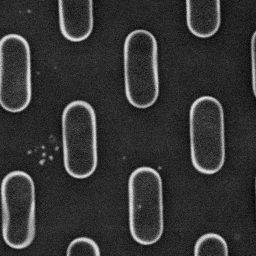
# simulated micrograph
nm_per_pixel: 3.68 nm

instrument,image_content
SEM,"groups of lines, slits or small figures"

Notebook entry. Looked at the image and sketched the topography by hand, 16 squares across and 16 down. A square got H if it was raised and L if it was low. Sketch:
LLLLHHLLLLLLHHLL
LLLLHHLLLLLLHHLL
HLLLLLLLHHLLLLLL
HHLLLLLLHHLLLLLL
HHLLLLLLHHLLLLLL
HHLLLLLLHHLLLLLL
HHLLLLLLHLLLHHLL
LLLLHHLLLLLLHHLL
LLLLHHLLLLLLHHLL
LLLLHHLLLLLLHHLL
LLLLHHLLLLLLHHLL
HHLLLLLLHHLLLLLL
HHLLLLLLHHLLLLLL
HHLLLLLLHHLLLLLL
HHLLLLLLHHLLLLLL
LLLLHHLLLLLLHHLL